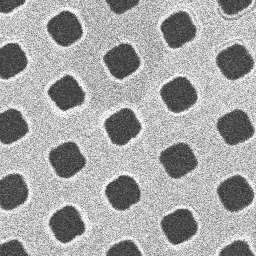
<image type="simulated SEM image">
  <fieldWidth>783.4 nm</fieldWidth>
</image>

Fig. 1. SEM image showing a regular array of holes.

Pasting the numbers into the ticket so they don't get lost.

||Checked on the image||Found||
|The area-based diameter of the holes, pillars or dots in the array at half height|103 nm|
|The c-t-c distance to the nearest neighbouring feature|0.198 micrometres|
